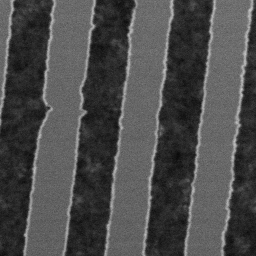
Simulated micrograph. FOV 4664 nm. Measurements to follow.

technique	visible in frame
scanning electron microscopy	one or a few lines or trenches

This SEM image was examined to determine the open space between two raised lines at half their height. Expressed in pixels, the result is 41.5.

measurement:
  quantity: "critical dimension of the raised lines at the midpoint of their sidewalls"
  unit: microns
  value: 0.688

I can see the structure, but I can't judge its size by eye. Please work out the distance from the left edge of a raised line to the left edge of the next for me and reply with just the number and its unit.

1440 nm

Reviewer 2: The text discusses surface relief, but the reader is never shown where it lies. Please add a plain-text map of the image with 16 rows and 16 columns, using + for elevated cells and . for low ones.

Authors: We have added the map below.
+..+++..+++..+++
+..+++..+++..+++
+..+++..++...++.
...++...++...++.
...++...++...++.
...++...++...++.
...++...++...++.
...++...++...++.
..+++..+++..+++.
..+++..+++..+++.
..+++..+++..+++.
..+++..++...++..
..++...++...++..
..++...++...++..
..++...++...++..
..++...++...++..